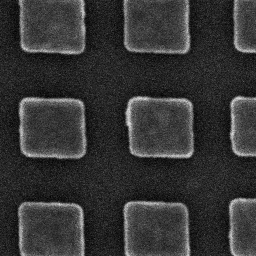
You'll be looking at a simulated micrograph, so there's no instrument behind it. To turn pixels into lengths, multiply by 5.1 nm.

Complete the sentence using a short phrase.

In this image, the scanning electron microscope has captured raised bodies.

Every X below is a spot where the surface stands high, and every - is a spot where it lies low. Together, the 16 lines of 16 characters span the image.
-XXXX---XXXX---X
-XXXX---XXXX---X
-XXXX---XXXX---X
----------------
----------------
----------------
-XXXX---XXXX---X
-XXXX---XXXX--XX
-XXXX---XXXX--XX
--XXX---XXXX---X
----------------
----------------
---------------X
-XXXX---XXXX--XX
-XXXX---XXXX--XX
-XXXX---XXXX--XX